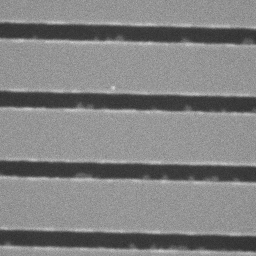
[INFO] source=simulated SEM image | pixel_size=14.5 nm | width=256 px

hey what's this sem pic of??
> lines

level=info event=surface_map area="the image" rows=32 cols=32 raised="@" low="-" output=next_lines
@@@@@@@@@@@@@@@@@@@@@@@@@@@@@@@@
@@@@@@@@@@@@@@@@@@@@@@@@@@@@@@@@
@@@@@@@@@@@@@@@@@@@@@@@@@@@@@@@@
-------------------------------@
--------------------------------
@@@@@@@@@@@@@@@@@@@@@@@@@@------
@@@@@@@@@@@@@@@@@@@@@@@@@@@@@@@@
@@@@@@@@@@@@@@@@@@@@@@@@@@@@@@@@
@@@@@@@@@@@@@@@@@@@@@@@@@@@@@@@@
@@@@@@@@@@@@@@@@@@@@@@@@@@@@@@@@
@@@@@@@@@@@@@@@@@@@@@@@@@@@@@@@@
------------@@@@@@@@@@@@@@@@@@@@
--------------------------------
@@------------------------------
@@@@@@@@@@@@@@@@@@@@@@@@@@@@@@@@
@@@@@@@@@@@@@@@@@@@@@@@@@@@@@@@@
@@@@@@@@@@@@@@@@@@@@@@@@@@@@@@@@
@@@@@@@@@@@@@@@@@@@@@@@@@@@@@@@@
@@@@@@@@@@@@@@@@@@@@@@@@@@@@@@@@
@@@@@@@@@@@@@@@@@@@@@@@@@@@@@@@@
----------------------@@@@@@@@@@
--------------------------------
@@@@@@@@@@@@@@@@@@--------------
@@@@@@@@@@@@@@@@@@@@@@@@@@@@@@@@
@@@@@@@@@@@@@@@@@@@@@@@@@@@@@@@@
@@@@@@@@@@@@@@@@@@@@@@@@@@@@@@@@
@@@@@@@@@@@@@@@@@@@@@@@@@@@@@@@@
@@@@@@@@@@@@@@@@@@@@@@@@@@@@@@@@
@@@@@@@@@@@@@@@@@@@@@@@@@@@@@@@@
--------------------------------
--------------------------------
@@@@@@@@@@@@@@@@@@@@@@@@@@@-----